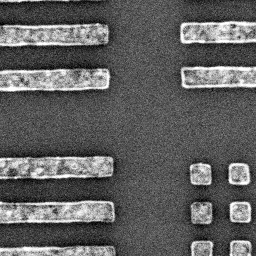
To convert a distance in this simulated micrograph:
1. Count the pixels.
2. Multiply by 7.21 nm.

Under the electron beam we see groups of lines, slits or small figures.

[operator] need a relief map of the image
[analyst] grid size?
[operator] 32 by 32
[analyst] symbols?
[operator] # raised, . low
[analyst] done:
................................
................................
................................
#############..........#########
#############..........#########
###.............................
................................
................................
................................
#############..........#########
#############..........#########
................................
................................
................................
................................
................................
................................
................................
................................
................................
##############..................
##############..........##...##.
........................##...##.
................................
................................
#........#####..........##...##.
##############..........##...##.
##############..........##...##.
................................
................................
........................##...##.
##############..........##...##.